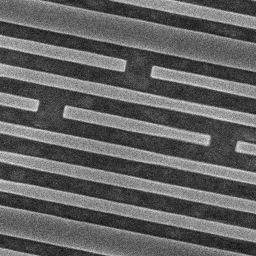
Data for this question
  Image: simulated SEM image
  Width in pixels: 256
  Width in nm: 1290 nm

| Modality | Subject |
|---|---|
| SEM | groups of lines, slits or small figures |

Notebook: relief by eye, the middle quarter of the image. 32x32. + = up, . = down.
........+++++++.................
.............++.......+++++.....
......................++++++++++
+......................+++++++++
++++++......................++++
++++++++++++....................
..+++++++++++++++...............
......+++++++++++++++...........
............++++++++++++++......
.................++++++++++++++.
.......................+++++++++
++++++......................++++
++++++++++......................
.+++++++++++++++................
......++++++++++++++............
..........++++++++++++++........
...............++++++++++++++...
.....................+++++++++++
+++++.......................++++
+++++++++.......................
++++++++++++++..................
.....++++++++++++++.............
..........++++++++++++++........
..............++++++++++++++....
....................++++++++++++
++++......................++++++
+++++++++......................+
+++++++++++++...................
....++++++++++++++..............
.........++++++++++++++.........
..............++++++++++++++....
...................+++++++++++++